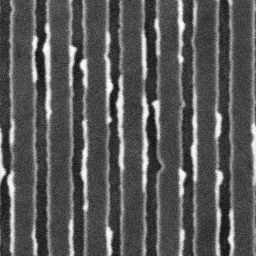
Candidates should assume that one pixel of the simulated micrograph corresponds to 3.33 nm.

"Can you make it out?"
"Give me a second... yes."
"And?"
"parallel lines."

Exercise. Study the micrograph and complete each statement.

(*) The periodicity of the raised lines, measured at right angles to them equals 122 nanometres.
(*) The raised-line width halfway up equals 0.084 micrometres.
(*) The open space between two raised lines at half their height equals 36.6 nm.